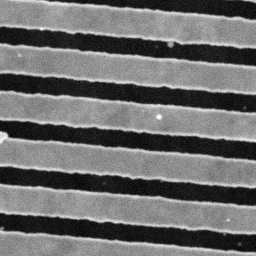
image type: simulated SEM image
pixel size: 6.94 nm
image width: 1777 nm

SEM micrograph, lines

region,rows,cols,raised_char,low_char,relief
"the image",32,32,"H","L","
HHHHHHHHHHLLLLLLLLLLLLLLLLLLLLLL
HHHHHHHHHHHHHHHHHHHHHLLLLLLLLLLL
HHHHHHHHHHHHHHHHHHHHHHHHHHHHHHHL
LLHHHHHHHHHHHHHHHHHHHHHHHHHHHHHH
LLLLLLLLLLLLLLHHHHHHHHHHHHHHHHHH
HLLLLLLLLLLLLLLLLLLLLLLLLLHHHHHH
HHHHHHHHHHHHLLLLLLLLLLLLLLLLLLLL
HHHHHHHHHHHHHHHHHHHHHHHLLLLLLLLL
HHHHHHHHHHHHHHHHHHHHHHHHHHHHHHHH
LLLLLHHHHHHHHHHHHHHHHHHHHHHHHHHH
LLLLLLLLLLLLLLLLHHHHHHHHHHHHHHHH
HHLLLLLLLLLLLLLLLLLLLLLLLLHHHHHH
HHHHHHHHHHHHHLLLLLLLLLLLLLLLLLLL
HHHHHHHHHHHHHHHHHHHHHHHHLLLLLLLL
HHHHHHHHHHHHHHHHHHHHHHHHHHHHHHHH
LLLLLLLHHHHHHHHHHHHHHHHHHHHHHHHH
LLLLLLLLLLLLLLLLLLHHHHHHHHHHHHHH
HHHLLLLLLLLLLLLLLLLLLLLLLLLLLLHH
HHHHHHHHHHHHHHHLLLLLLLLLLLLLLLLL
HHHHHHHHHHHHHHHHHHHHHHHHHHLLLLLL
HHHHHHHHHHHHHHHHHHHHHHHHHHHHHHHH
LLLLLLLLHHHHHHHHHHHHHHHHHHHHHHHH
LLLLLLLLLLLLLLLLLLLLLHHHHHHHHHHH
HHHHHHLLLLLLLLLLLLLLLLLLLLLLLLLL
HHHHHHHHHHHHHHHHHHLLLLLLLLLLLLLL
HHHHHHHHHHHHHHHHHHHHHHHHHHHHLLLL
HHHHHHHHHHHHHHHHHHHHHHHHHHHHHHHH
LLLLLLLLLLLHHHHHHHHHHHHHHHHHHHHH
LLLLLLLLLLLLLLLLLLLLLLHHHHHHHHHH
HHHHHHHHLLLLLLLLLLLLLLLLLLLLLLLL
HHHHHHHHHHHHHHHHHHHHLLLLLLLLLLLL
HHHHHHHHHHHHHHHHHHHHHHHHHHHHHHLL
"